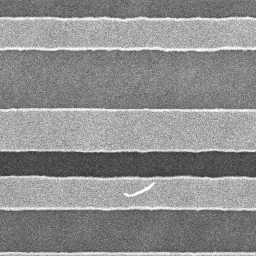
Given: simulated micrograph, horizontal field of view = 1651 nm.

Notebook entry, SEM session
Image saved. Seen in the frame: lines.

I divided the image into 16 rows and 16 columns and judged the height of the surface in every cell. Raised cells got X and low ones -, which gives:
----------------
XXXXXXXXXXXXXXXX
XXXXXXXXXXXXXXXX
----------------
----------------
----------------
----------------
XXXXXXXXXXXXXXXX
XXXXXXXXXXXXXXXX
------X-X-------
----------------
XXXXXXXXXXXXXXXX
XXXXXXXXXXXXXXXX
----------------
----------------
----------------